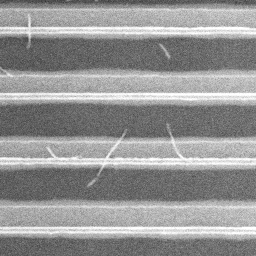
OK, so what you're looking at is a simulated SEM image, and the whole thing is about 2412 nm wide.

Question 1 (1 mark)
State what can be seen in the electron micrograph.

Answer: lines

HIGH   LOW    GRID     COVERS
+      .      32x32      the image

................................
++++++++++++++++++++++++++++++++
++++++++++++++++++++++++++++++++
++++++++++++++++++++++++++++++++
................................
................................
................................
................................
................................
++++++++++++++++++++++..++++++++
++++++++++++++++++++++++++++++++
++++++++++++++++++++++++++++++++
................................
................................
................................
................................
................................
................................
++++++++++++++++++++++++++++++++
++++++++++++++++++++++++++++++++
++..........++.....++.++.++++.++
................................
................................
................................
................................
................................
++++++++++++++++++++++++++++++++
++++++++++++++++++++++++++++++++
++++++++++++++++++++++++++++++++
................................
................................
................................